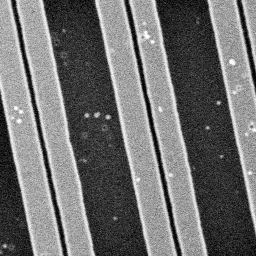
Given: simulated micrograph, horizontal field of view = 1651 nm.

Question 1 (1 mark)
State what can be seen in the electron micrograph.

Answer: lines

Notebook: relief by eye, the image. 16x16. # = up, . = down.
###...####...###
###...####...###
###....###....##
###....###....##
####...####...##
####...####...##
####...####...##
####....###....#
.###....###....#
.####...####...#
.####...####...#
.####...####...#
.####....###....
..###....###....
..####...####...
..####...####...